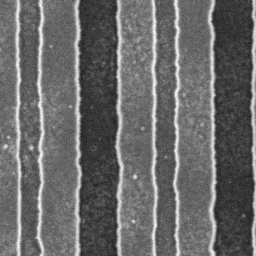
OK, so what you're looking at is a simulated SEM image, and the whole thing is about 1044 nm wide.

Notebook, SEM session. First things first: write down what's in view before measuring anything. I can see lines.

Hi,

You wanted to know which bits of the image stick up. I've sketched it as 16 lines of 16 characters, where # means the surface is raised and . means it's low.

#####..######...
#####..######...
#####..######...
#####..######...
#####..######...
#####..######...
#####..######...
#####..######...
#####..######...
#####..######...
#####...#####...
#####...#####...
#####..######...
#####..######...
#####..######...
#####..######...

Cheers